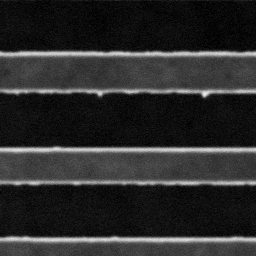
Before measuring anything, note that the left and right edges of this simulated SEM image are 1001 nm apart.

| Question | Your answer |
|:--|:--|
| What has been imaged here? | lines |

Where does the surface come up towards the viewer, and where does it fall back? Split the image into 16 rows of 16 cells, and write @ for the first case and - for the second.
----------------
----------------
----------------
@@@@@@@@@@@@@@@@
@@@@@@@@@@@@@@@@
@@@@@@@@@@@@@@@@
----------------
----------------
----------------
@@@@@@@@@@@@@@@@
@@@@@@@@@@@@@@@@
----------------
----------------
----------------
----------------
@@@@@@@@@@@@@@@@